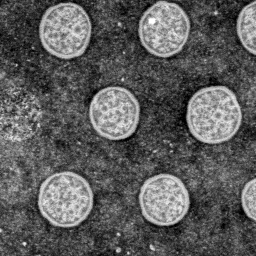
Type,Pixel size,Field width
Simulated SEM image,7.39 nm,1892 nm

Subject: raised bodies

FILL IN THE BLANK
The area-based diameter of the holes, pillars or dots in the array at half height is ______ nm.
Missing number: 380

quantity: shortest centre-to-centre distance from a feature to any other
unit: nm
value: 725